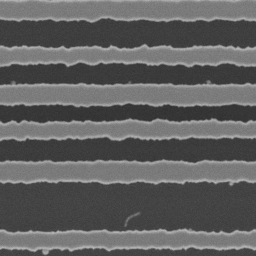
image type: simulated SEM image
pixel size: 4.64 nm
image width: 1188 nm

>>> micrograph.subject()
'lines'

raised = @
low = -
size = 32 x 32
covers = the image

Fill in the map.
@@@@@@@@@@@@@@@@@@@@@@@@@@@@@@@@
@@@@@@@@@@@@@@@@@@@@@@@@@@@@@@@@
-@@@@--@@@@@--@@@-@@@@@@@@@-@@-@
--------------------------------
--------------------------------
--------------------------------
@@@@@@@@@@@@@@@@@@@@@@@@@@@@@@@@
@@@@@@@@@@@@@@@@@@@@@@@@@@@@@@@@
--------------------------------
--------------------------------
-----@---@@-------------------@@
@@@@@@@@@@@@@@@@@@@@@@@@@@@@@@@@
@@@@@@@@@@@@@@@@@@@@@@@@@@@@@@@@
--------------------------------
--------------------------------
@@@@@@@@@@@@@@@@@@@@@@@@@@@@@@@@
@@@@@@@@@@@@@@@@@@@@@@@@@@@@@@@@
@-@-----------@-----------------
--------------------------------
--------------------------------
@@@@@@@@@@@@@@@@@@@@@@@@@@@@@@@@
@@@@@@@@@@@@@@@@@@@@@@@@@@@@@@@@
@@@@@@@@@@@@@@@@@@@@@@@@@@@@@@@@
--------------------------------
--------------------------------
--------------------------------
--------------------------------
--------------------------------
--------------------------------
@@@@@@@@@@@@@@@@@@@@@@@@@@@@@@@@
@@@@@@@@@@@@@@@@@@@@@@@@@@@@@@@@
--------------------------------